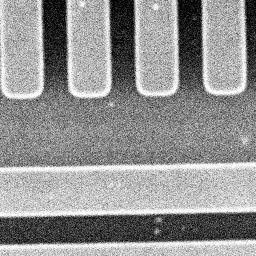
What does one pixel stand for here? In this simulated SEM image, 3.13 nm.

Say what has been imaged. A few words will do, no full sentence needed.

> groups of lines, slits or small figures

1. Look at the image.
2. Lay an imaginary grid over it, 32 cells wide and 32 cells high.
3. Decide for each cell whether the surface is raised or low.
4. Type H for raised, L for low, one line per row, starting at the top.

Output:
HHHHHLLLLHHHHHLLLHHHHHLLLHHHHHHL
HHHHHLLLLHHHHHLLLHHHHHLLLHHHHHHL
HHHHHLLLLHHHHHLLLHHHHHLLLHHHHHHL
HHHHHLLLLHHHHHLLLHHHHHLLLHHHHHHL
HHHHHLLLLHHHHHLLLHHHHHLLLHHHHHHL
HHHHHLLLLHHHHHLLLHHHHHLLLHHHHHHL
HHHHHLLLLHHHHHLLLHHHHHLLLHHHHHHL
HHHHHLLLLHHHHHLLLHHHHHLLLHHHHHHL
HHHHHLLLLHHHHHLLLHHHHHLLLLHHHHHL
HHHHHLLLLHHHHHLLLHHHHHLLLLHHHHHL
HHHHHLLLLHHHHHLLLHHHHHLLLLHHHHHL
HHHHHLLLLHHHHLLLLLHHHHLLLLHHHHLL
LLLLLLLLLLLLLLLLLLLLLLLLLLLLLLLL
LLLLLLLLLLLLLLLLLLLLLLLLLLLLLLLL
LLLLLLLLLLLLLLLLLLLLLLLLLLLLLLLL
LLLLLLLLLLLLLLLLLLLLLLLLLLLLLLLL
LLLLLLLLLLLLLLLLLLLLLLLLLLLLLLLL
LLLLLLLLLLLLLLLLLLLLLLLLLLLLLLLL
LLLLLLLLLLLLLLLLLLLLLLLLLLLLLLLL
LLLLLLLLLLLLLLLLLLLLLLLLLLLLLLLL
LLLLLLLLLLLLLLLLLLLLLLLLLLLLLLLL
HHHHHHHHHHHHHHHHHHHHHHHHHHHHHHHH
HHHHHHHHHHHHHHHHHHHHHHHHHHHHHHHH
HHHHHHHHHHHHHHHHHHHHHHHHHHHHHHHH
HHHHHHHHHHHHHHHHHHHHHHHHHHHHHHHH
HHHHHHHHHHHHHHHHHHHHHHHHHHHHHHHH
HHHHHHHHHHHHHHHHHHHHHHHHHLLLLLLL
LLLLLLLLLLLLLLLLLLLLLLLLLLLLLLLL
LLLLLLLLLLLLLLLLLLLLLLLLLLLLLLLL
LLLLLLLLLLLLLLLLLLLLLLLLLLLLLLLL
LLLLLLLLLLLLLLLLHHHHHHHHHHHHHHHH
HHHHHHHHHHHHHHHHHHHHHHHHHHHHHHHH